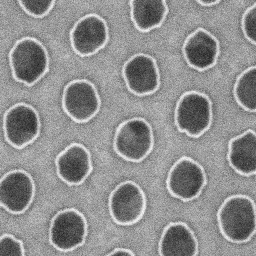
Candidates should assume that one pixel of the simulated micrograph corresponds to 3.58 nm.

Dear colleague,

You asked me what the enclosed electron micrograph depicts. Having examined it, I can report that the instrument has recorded a regular array of raised bodies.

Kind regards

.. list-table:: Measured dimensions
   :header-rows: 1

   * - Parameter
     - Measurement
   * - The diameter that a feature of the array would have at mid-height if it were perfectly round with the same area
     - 142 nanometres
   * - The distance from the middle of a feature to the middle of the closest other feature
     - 0.23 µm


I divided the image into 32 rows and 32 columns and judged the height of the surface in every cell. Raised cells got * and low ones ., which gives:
...****.........*****....**.....
...***..........*****..........*
..........***....***..........**
.........****....**...........**
.........****...........***....*
..***....****..........****.....
.*****....**...........****.....
.*****..........***....****.....
.*****.........*****....**.....*
..***..........*****..........**
...*.....**.....****.........***
........****....***.....*....***
........****..........****....**
.***....****..........****.....*
.****....***..........****......
.****..........****...****......
.****..........****....**......*
.***..........*****..........***
........***...*****..........***
.......****....***...........***
.......****...........***....***
.**....****..........****.....**
****....**...........*****......
****...........**....****.......
****..........****....***....*..
****..........****..........****
.**.....**....****.........*****
.......****...***..........*****
......*****..........***....****
*.....*****.........****....***.
***....***..........*****.......
***...........**....*****.......